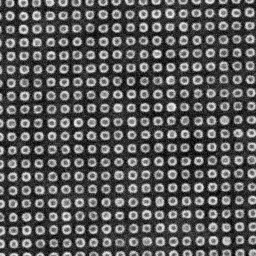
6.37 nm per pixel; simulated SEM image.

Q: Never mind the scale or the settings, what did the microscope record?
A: a regular array of raised bodies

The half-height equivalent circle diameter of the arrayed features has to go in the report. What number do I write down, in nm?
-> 49.8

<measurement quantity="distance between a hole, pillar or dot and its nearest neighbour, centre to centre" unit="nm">82.6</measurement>